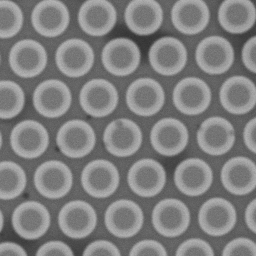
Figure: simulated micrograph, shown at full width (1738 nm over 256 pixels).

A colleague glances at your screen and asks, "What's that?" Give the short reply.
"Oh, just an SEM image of an array of small figures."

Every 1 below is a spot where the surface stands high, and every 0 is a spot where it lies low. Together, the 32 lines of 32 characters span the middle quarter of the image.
11111110001111111100001111111100
11111100000111111100000111111000
11111000000011110000000011110000
00000000000000000000000000000011
00000011111000000111111000000111
10000111111100001111111100001111
10001111111110001111111110001111
11001111111110001111111110011111
11001111111110001111111110011111
11001111111110001111111110011111
10001111111110001111111100001111
10000111111100000111111100000111
00000011111000000011110000000011
00000000000000000000000000000000
01111000000011111000000111111000
11111100000111111100001111111100
11111110001111111110001111111110
11111111001111111110001111111110
11111111001111111110001111111110
11111111001111111110001111111110
11111110001111111110001111111100
11111110000111111100000111111100
11111100000011111000000011110000
00000000000000000000000000000000
00000001111000000011111000000011
10000011111110000111111100001111
10000111111110001111111110001111
11001111111111001111111110001111
11001111111111001111111110001111
11001111111111001111111110001111
11000111111110001111111110001111
10000111111110000111111100000111